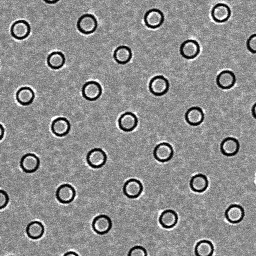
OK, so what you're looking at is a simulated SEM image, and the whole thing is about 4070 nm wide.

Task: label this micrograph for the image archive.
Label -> a regular array of ring-shaped grooves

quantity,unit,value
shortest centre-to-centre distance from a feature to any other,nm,748